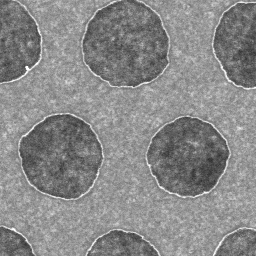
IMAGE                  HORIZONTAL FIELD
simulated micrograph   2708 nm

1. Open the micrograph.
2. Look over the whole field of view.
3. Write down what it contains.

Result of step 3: holes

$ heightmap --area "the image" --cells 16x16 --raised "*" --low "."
..****...*****..
..****....****..
...**......**...
...**.....****..
..****....****..
***************.
****************
***..******..***
**....****....**
*.....***.....**
*.....***.....**
**....****...***
****************
****************
.******.*******.
..****....****..